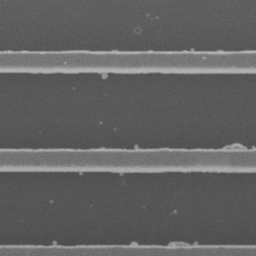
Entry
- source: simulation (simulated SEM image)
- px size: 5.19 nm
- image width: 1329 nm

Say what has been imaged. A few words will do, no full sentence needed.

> lines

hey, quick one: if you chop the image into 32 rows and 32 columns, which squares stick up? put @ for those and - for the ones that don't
--------------------------------
--------------------------------
--------------------------------
--------------------------------
--------------------------------
--------------------------------
--------@@@--------------------@
@@@@@@@@@@@@@@@@@@@@@@@@@@@@@@@@
@@@@@@@@@@@@@@@@@@@@@@@@@@@@@@@@
--------------------------------
--------------------------------
--------------------------------
--------------------------------
--------------------------------
--------------------------------
--------------------------------
--------------------------------
--------------------------------
--------------------------------
@@@@@@@@@@@@@@@@@@@@@@@@@@@@@@@@
@@@@@@@@@@@@@@@@@@@@@@@@@@@@@@@@
--------------------------------
--------------------------------
--------------------------------
--------------------------------
--------------------------------
--------------------------------
--------------------------------
--------------------------------
--------------------------------
--------------------------------
@@@@@@@@@@@@@@@@@@@@@@@@@@@@@@@@